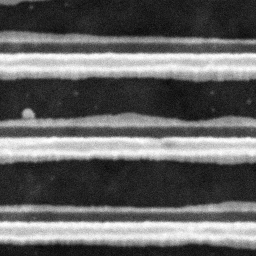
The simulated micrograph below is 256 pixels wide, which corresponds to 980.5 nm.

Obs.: lines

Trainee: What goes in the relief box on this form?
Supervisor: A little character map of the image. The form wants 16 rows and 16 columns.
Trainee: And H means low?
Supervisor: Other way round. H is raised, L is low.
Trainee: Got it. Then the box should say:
LLLLLLLLLLLLLLLL
LLLLLLLLLLLLLLLL
HHHHHHHHHHHLLLLL
HHHHHHHHHHHHHHHH
HHHHHHHHHHHHHHHH
LLLLLLLLLLLLLLLL
LLLLLLLLLLLLLLLL
LLLLLLLLLLLLLLLL
HHHHHHHHHHHHHHHH
HHHHHHHHHHHHHHHH
LLLLLLLLLLLLLLLL
LLLLLLLLLLLLLLLL
LLLLLLLLLLLLLLLL
HHHHHHHHHHHHHHHH
HHHHHHHHHHHHHHHH
LLLLLLLLLLLLLLLL